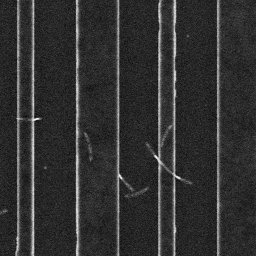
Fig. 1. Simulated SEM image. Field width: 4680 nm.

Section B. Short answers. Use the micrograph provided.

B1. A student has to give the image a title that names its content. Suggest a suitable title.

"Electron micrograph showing lines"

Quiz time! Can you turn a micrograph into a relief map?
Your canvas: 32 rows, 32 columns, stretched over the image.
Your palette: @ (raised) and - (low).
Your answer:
--@@------@@@@@-----@@-----@@@@@
--@@------@@@@@-----@@-----@@@@@
--@@------@@@@@-----@@-----@@@@@
--@@------@@@@@-----@@-----@@@@@
--@@------@@@@@-----@@-----@@@@@
--@@------@@@@@-----@@-----@@@@@
--@@------@@@@@-----@@-----@@@@@
--@@------@@@@@-----@@-----@@@@@
--@@------@@@@@-----@@-----@@@@@
--@@------@@@@@-----@@-----@@@@@
--@@------@@@@@-----@@-----@@@@@
--@@------@@@@@-----@@-----@@@@@
--@@------@@@@@-----@@-----@@@@@
--@@------@@@@@-----@@-----@@@@@
--@@------@@@@@-----@@-----@@@@@
--@@------@@@@@-----@@-----@@@@@
--@@------@@@@@-----@@-----@@@@@
--@@------@@@@@-----@@-----@@@@@
--@@------@@@@@-----@@-----@@@@@
--@@------@@@@@-----@@-----@@@@@
--@@------@@@@@-----@@-----@@@@@
--@@------@@@@@-----@@-----@@@@@
--@@------@@@@@-----@@-----@@@@@
--@@------@@@@@-----@@-----@@@@@
--@@------@@@@@-----@@-----@@@@@
--@@------@@@@@-----@@-----@@@@@
--@@------@@@@@-----@@-----@@@@@
--@@------@@@@@-----@@-----@@@@@
--@@------@@@@@-----@@-----@@@@@
--@@------@@@@@-----@@-----@@@@@
--@@------@@@@@-----@@-----@@@@@
--@@------@@@@@-----@@-----@@@@@